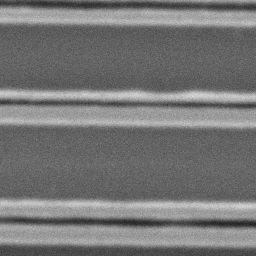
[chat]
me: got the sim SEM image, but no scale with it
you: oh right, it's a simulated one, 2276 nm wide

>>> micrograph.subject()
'lines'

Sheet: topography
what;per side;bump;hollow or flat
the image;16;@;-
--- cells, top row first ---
@@@@@@@@@@@@@@@@
----------------
----------------
----------------
----------------
----------------
@@@@@@@@@@@@@@@@
@@@@@@@@@@@@@@@@
----------------
----------------
----------------
----------------
----------------
@@@@@@@@@@@@@@@@
@@@@@@@@@@@@@@@@
----------------